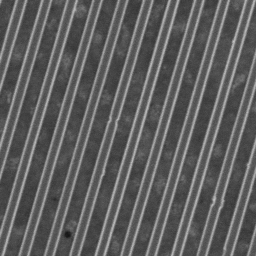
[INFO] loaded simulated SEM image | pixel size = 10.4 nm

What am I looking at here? parallel lines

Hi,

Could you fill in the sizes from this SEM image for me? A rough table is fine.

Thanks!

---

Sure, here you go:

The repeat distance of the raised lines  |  254 nanometers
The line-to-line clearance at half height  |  162 nm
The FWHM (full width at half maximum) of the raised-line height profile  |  91.1 nm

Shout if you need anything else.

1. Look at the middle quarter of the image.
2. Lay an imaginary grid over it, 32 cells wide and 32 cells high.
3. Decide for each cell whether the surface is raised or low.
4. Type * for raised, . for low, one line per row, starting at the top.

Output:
...**....**....***....**....**..
..**....***....**....***....**..
..**....***....**....**....***..
..**....**....***....**....**...
.**.....**....**....***....**...
.**....***....**....**.....**...
.**....**....***....**....**....
***....**....***....**....**....
**....***....**....***....**....
**....**.....**....**....***....
**....**....***....**....**....*
*.....**....**....***....**....*
*....**.....**....**....***....*
*....**.....**....**....**.....*
*....**....**.....**....**....**
....***....**....***....**....**
....**.....**....**....***....**
....**....***....**....**....***
....**....**....***....**....**.
...**.....**....**....***....**.
...**....***....**....**.....**.
...**....**.....**....**....**..
..***....**....***....**....**..
..**....***....**....***....**..
..**....***....**....**....***..
.***....**....***....**....**...
.**.....**....**....***....**...
.**....***....**....**....***...
.**....**.....**....**....**....
***....**....**.....**....**....
**....***....**....***....**....
**....***....**....**....***....